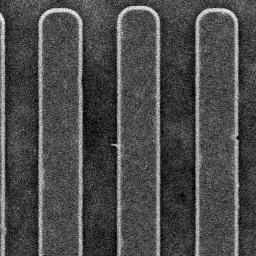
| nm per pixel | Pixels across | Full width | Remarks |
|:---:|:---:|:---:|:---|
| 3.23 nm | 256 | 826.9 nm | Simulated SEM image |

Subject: one or a few lines or trenches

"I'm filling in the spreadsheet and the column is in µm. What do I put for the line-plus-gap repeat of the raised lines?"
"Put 0.253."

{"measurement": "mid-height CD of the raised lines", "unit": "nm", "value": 128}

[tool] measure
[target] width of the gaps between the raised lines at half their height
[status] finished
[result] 122 nm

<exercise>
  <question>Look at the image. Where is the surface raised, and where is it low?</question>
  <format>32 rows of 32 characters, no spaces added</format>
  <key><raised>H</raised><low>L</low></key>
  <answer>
LLLLLLLLLLLLLLLLLLLLLLLLLLLLLLLL
LLLLLLHHHLLLLLLHHHHLLLLLLLHHHLLL
LLLLLHHHHHLLLLLHHHHHLLLLLHHHHHLL
LLLLLHHHHHLLLLLHHHHHLLLLLHHHHHLL
LLLLLHHHHHLLLLLHHHHHLLLLLHHHHHLL
LLLLLHHHHHLLLLLHHHHHLLLLLHHHHHLL
LLLLLHHHHHLLLLLHHHHHLLLLLHHHHHLL
LLLLLHHHHHLLLLLHHHHHLLLLLHHHHHLL
LLLLLHHHHHLLLLLHHHHHLLLLLHHHHHLL
LLLLLHHHHHLLLLLHHHHHLLLLLHHHHHLL
LLLLLHHHHHLLLLLHHHHHLLLLLHHHHHLL
LLLLLHHHHHLLLLLHHHHHLLLLLHHHHHLL
LLLLLHHHHHLLLLLHHHHHLLLLLHHHHHLL
LLLLLHHHHHLLLLLHHHHHLLLLLHHHHHLL
LLLLLHHHHHLLLLLHHHHHLLLLLHHHHHLL
LLLLLHHHHHLLLLLHHHHHLLLLLHHHHHLL
LLLLLHHHHHLLLLLHHHHHLLLLLHHHHHLL
LLLLLHHHHHLLLLLHHHHHLLLLLHHHHHLL
LLLLLHHHHHLLLLLHHHHHLLLLLHHHHHLL
LLLLLHHHHHLLLLLHHHHHLLLLLHHHHHLL
LLLLLHHHHHLLLLLHHHHHLLLLLHHHHHLL
LLLLLHHHHHLLLLLHHHHHLLLLLHHHHHLL
LLLLLHHHHHLLLLLHHHHHLLLLLHHHHHLL
LLLLLHHHHHLLLLLHHHHHLLLLLHHHHHLL
LLLLLHHHHHLLLLLHHHHHLLLLLHHHHHLL
LLLLLHHHHHLLLLLHHHHHLLLLLHHHHHLL
LLLLLHHHHHLLLLLHHHHHLLLLLHHHHHLL
LLLLLHHHHHLLLLLHHHHHLLLLLHHHHHLL
LLLLLHHHHHLLLLLHHHHHLLLLLHHHHHLL
LLLLLHHHHHLLLLLHHHHHLLLLLHHHHHLL
LLLLLHHHHHLLLLLHHHHHLLLLLHHHHHLL
LLLLLHHHHHLLLLLHHHHHLLLLLHHHHHLL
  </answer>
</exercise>